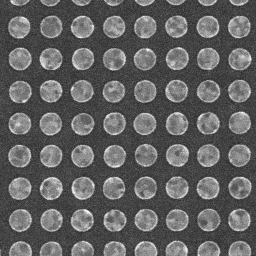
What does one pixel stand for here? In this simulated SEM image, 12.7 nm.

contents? a regular array of raised bodies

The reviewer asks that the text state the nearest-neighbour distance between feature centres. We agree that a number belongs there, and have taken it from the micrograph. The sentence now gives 394 nanometres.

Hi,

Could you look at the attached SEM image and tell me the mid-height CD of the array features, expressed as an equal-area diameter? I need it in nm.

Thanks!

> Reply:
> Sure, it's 273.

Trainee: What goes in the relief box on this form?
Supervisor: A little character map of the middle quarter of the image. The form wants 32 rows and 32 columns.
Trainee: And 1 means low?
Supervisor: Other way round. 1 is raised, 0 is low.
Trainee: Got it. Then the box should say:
00011110001111100011110000111100
00000000000000000000000000000000
00000000000000000000000000000000
00000000000000000000000000000000
00011100000111000001110000011100
00111110001111100011111000111110
00111110001111100011111000111110
00111110001111100011111000111110
00111110001111000011110000111100
00000000000000000000000000000000
00000000000000000000000000000000
00000000000000000000000000000000
00001000000111000000100000011000
00011110000111100011110000111110
00111110001111100011111000111110
00111110001111100011111000111110
00011110000111100011110000111100
00001100000010000001100000011000
00000000000000000000000000000000
00000000000000000000000000000000
00001100000000000001110000011100
00111110000111100011111000111110
00111110001111100011111000111110
00111110001111100011111000111110
00111110001111100011111000111100
00001100000111000000100000000000
00000000000000000000000000000000
00000000000000000000000000000000
00000000000011000001110000011000
00111110001111100011111000111110
00111110001111100011111000111110
00111110001111100011111000111110